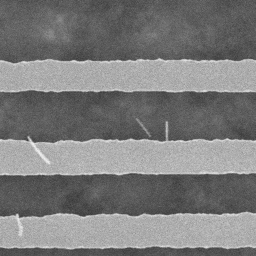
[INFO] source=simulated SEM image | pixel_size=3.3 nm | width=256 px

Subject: lines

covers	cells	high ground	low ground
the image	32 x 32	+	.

................................
................................
................................
................................
................................
................................
................................
......+..........++++.++....+.++
++++++++++++++++++++++++++++++++
++++++++++++++++++++++++++++++++
++++++++++++++++++++++++++++++++
................................
................................
................................
................................
................................
................................
++.........+++..+++.....++.++++.
++++++++++++++++++++++++++++++++
++++++++++++++++++++++++++++++++
++++++++++++++++++++++++++++++++
++++++++++++++++++++++++++++++++
................................
................................
................................
................................
................................
++++++++++++++++++++++++++++++++
++++++++++++++++++++++++++++++++
++++++++++++++++++++++++++++++++
++++++++++++++++++++++++++++++++
................................